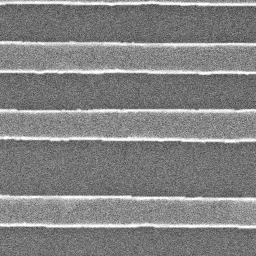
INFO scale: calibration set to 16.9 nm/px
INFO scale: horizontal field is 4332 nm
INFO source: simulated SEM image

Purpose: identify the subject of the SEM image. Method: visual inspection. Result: lines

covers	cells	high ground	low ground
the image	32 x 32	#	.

...........................#..##
................................
................................
................................
................................
##############..................
################################
################################
################################
................................
................................
................................
................................
................................
################################
################################
################################
.......................########.
................................
................................
................................
................................
................................
................................
................................
################################
################################
################################
................................
................................
................................
................................